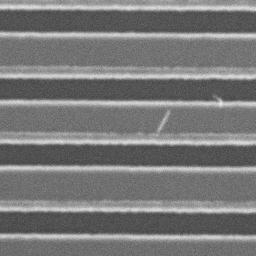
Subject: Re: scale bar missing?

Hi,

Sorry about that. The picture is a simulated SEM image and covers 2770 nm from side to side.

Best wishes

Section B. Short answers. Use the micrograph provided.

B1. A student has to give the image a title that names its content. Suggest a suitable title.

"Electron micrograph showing lines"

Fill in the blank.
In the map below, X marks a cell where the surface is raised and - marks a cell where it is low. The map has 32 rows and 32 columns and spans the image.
XXXXXXXXXXXXXXXXXXXXXXXXXXXXXXXX
--------------------------------
--------------------------------
--------------------------------
XXXXXXXXXXXXXXXXXXXXXXXXXXXXXXXX
XXXXXXXXXXXXXXXXXXXXXXXXXXXXXXXX
XXXXXXXXXXXXXXXXXXXXXXXXXXXXXXXX
XXXXXXXXXXXXXXXXXXXXXXXXXXXXXXXX
XXXXXXXXXXXXXXXXXXXXXXXXXXXXXXXX
-X---XXXXXXXXXXXXXXXXXXXXXXXXXXX
--------------------------------
--------------------------------
--------------------------------
XXXXXXXXXXXXXXXXXXXXXXXXXXXXXXXX
XXXXXXXXXXXXXXXXXXXXXXXXXXXXXXXX
XXXXXXXXXXXXXXXXXXXXXXXXXXXXXXXX
XXXXXXXXXXXXXXXXXXXXXXXXXXXXXXXX
XXXXXXXXXXXXXXXXXXXXXXXXXXXXXXXX
--------------------------------
--------------------------------
--------------------------------
XXXXXXXXXXXXXXXXXXXXXXXXXXXXXXXX
XXXXXXXXXXXXXXXXXXXXXXXXXXXXXXXX
XXXXXXXXXXXXXXXXXXXXXXXXXXXXXXXX
XXXXXXXXXXXXXXXXXXXXXXXXXXXXXXXX
XXXXXXXXXXXXXXXXXXXXXXXXXXXXXXXX
--------------------------------
--------------------------------
--------------------------------
--------------------------------
XXXXXXXXXXXXXXXXXXXXXXXXXXXXXXXX
XXXXXXXXXXXXXXXXXXXXXXXXXXXXXXXX